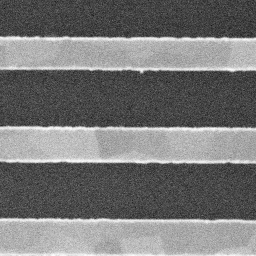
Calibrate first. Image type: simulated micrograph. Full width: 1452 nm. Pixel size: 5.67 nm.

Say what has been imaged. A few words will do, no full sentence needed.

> lines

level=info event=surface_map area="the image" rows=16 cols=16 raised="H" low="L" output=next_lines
LLLLLLLLLLLLLLLL
LLLLLLLLLLLLLLLL
HHHHHHHHHHHHHHHH
HHHHHHHHHHHHHHHH
LLLLLLLLLLLLLLLL
LLLLLLLLLLLLLLLL
LLLLLLLLLLLLLLLL
LLLLLLLLLLLLLLLL
HHHHHHHHHHHHHHHH
HHHHHHHHHHHHHHHH
LLLLLLLLLLLLLLLL
LLLLLLLLLLLLLLLL
LLLLLLLLLLLLLLLL
LLLLLLLLLLLLLLLL
HHHHHHHHHHHHHHHH
HHHHHHHHHHHHHHHH